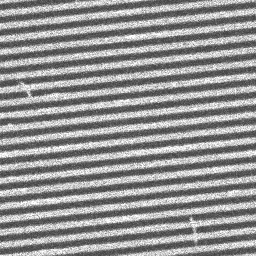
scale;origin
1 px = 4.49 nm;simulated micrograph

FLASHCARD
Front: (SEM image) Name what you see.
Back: parallel lines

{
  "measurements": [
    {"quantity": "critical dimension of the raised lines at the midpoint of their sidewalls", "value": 0.0245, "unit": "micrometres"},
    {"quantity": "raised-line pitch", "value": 57.5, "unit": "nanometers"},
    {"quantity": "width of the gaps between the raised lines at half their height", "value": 32.9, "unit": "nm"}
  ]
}